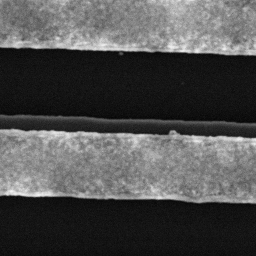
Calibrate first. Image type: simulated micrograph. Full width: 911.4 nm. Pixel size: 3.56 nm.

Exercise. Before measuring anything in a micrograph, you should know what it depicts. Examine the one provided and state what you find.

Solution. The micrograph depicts lines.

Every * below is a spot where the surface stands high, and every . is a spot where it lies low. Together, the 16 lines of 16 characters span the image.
****************
****************
****************
................
................
................
................
**********......
****************
****************
****************
****************
...........*****
................
................
................